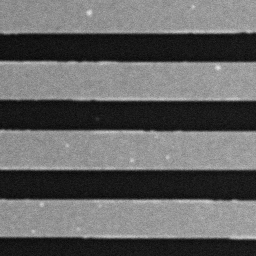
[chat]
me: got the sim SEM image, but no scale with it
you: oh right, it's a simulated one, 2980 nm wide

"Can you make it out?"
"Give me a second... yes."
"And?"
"lines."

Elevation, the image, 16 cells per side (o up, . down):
oooooooooooooooo
oooooooooooooooo
................
................
oooooooooooooooo
oooooooooooooooo
................
................
oooooooooooooooo
oooooooooooooooo
oooooooooooooooo
................
o...............
oooooooooooooooo
oooooooooooooooo
................